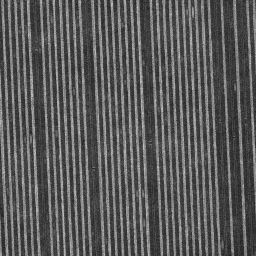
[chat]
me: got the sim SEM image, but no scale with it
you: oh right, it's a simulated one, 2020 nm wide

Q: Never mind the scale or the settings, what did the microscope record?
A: parallel lines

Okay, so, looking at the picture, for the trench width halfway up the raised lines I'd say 36.4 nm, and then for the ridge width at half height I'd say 14.8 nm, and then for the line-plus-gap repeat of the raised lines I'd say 50.8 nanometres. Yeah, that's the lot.